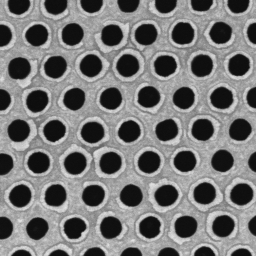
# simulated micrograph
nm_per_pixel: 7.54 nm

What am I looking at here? a regular array of holes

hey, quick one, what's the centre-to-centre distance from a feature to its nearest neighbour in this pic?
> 270 nm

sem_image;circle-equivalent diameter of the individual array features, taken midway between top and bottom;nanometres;162